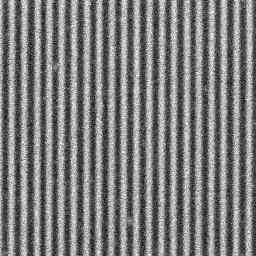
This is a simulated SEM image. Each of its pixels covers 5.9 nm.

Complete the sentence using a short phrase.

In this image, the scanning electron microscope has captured parallel lines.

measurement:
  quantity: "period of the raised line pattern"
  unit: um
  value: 0.0738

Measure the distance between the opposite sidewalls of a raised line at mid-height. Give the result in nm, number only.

22.9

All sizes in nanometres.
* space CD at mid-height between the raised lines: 50.2